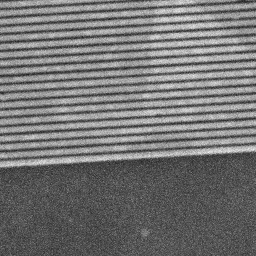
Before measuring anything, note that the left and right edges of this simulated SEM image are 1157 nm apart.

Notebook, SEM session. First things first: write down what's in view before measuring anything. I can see parallel lines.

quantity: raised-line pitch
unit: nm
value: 37.8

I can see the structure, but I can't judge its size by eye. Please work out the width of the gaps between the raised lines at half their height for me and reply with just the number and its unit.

0.0158 microns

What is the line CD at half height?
24.2 nm